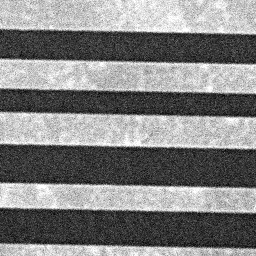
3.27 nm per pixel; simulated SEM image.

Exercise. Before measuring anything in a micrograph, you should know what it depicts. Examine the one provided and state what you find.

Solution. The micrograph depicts one or a few lines or trenches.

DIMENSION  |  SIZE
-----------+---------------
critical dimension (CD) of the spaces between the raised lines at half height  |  0.112 um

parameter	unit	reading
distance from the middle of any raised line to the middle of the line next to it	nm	198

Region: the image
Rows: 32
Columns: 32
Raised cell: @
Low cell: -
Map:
@@@@@@@@@@@@@@@@@@@@@@@@@@@@@@@@
@@@@@@@@@@@@@@@@@@@@@@@@@@@@@@@@
@@@@@@@@@@@@@@@@@@@@@@@@@@@@@@@@
@@@@@@@@@@@@@@@@@@@@@@@@@@@@@@@@
--------------------------------
--------------------------------
--------------------------------
@-------------------------------
@@@@@@@@@@@@@@@@@@@@@@@@@@@@@@@@
@@@@@@@@@@@@@@@@@@@@@@@@@@@@@@@@
@@@@@@@@@@@@@@@@@@@@@@@@@@@@@@@@
-------------------------@@@@@@@
--------------------------------
--------------------------------
@@@@@@@@@@@@@@@@@@--------------
@@@@@@@@@@@@@@@@@@@@@@@@@@@@@@@@
@@@@@@@@@@@@@@@@@@@@@@@@@@@@@@@@
@@@@@@@@@@@@@@@@@@@@@@@@@@@@@@@@
------------------------------@@
--------------------------------
--------------------------------
--------------------------------
--------------------------------
@@@@@@@@@@@@@@@@@@@@@@@@--------
@@@@@@@@@@@@@@@@@@@@@@@@@@@@@@@@
@@@@@@@@@@@@@@@@@@@@@@@@@@@@@@@@
--------------------------------
--------------------------------
--------------------------------
--------------------------------
--------------------------------
@@@@@@@@@@@@@@@@@@@@@@@@@@@@@@@@